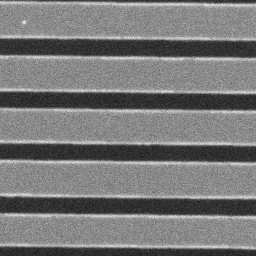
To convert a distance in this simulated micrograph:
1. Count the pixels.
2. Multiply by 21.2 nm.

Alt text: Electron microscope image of lines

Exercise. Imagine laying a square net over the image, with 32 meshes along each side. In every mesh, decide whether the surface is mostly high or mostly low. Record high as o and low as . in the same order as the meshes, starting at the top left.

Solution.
oooooooooooooooooo..............
oooooooooooooooooooooooooooooooo
oooooooooooooooooooooooooooooooo
oooooooooooooooooooooooooooooooo
oooooooooooooooooooooooooooooooo
................................
................................
oooooooooooooooooooooooooooooooo
oooooooooooooooooooooooooooooooo
oooooooooooooooooooooooooooooooo
oooooooooooooooooooooooooooooooo
......................oooooooooo
................................
................................
oooooooooooooooooooooooooooooooo
oooooooooooooooooooooooooooooooo
oooooooooooooooooooooooooooooooo
oooooooooooooooooooooooooooooooo
................................
................................
oooooooooooooooooooooooooooooooo
oooooooooooooooooooooooooooooooo
oooooooooooooooooooooooooooooooo
oooooooooooooooooooooooooooooooo
........oooooooooooooooooooooooo
................................
................................
oooooooooooooooooooooooooooooooo
oooooooooooooooooooooooooooooooo
oooooooooooooooooooooooooooooooo
oooooooooooooooooooooooooooooooo
................................